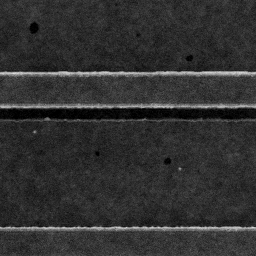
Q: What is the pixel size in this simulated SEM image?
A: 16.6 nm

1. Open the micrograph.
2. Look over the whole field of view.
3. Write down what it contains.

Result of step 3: lines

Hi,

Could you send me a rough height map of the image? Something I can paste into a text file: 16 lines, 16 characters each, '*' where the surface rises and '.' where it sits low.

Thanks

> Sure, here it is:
................
................
................
................
................
****************
****************
................
................
................
................
................
................
................
****************
****************